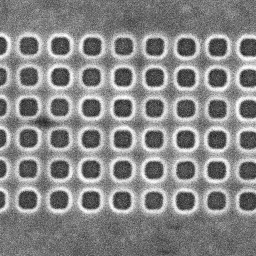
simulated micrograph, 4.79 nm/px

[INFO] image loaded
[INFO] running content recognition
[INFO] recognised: a regular array of holes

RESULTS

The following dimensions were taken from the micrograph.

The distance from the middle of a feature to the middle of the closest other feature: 0.147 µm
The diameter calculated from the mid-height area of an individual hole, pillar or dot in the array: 0.0994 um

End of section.